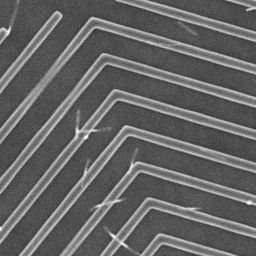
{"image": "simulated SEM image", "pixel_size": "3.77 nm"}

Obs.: groups of lines, slits or small figures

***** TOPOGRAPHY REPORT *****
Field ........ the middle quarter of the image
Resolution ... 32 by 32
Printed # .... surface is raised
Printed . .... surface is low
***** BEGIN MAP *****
.......###...########...........
......###.......########........
.....###............########....
.....##................########.
....###....................#####
...###........................##
..###...........................
..##.......######...............
.##........#########............
##........###...########........
##.......###.......########.....
#.......###............########.
........##................######
.......##....................###
......###.......................
.....###........................
...####.......#####.............
...###........#########.........
..####.......##....########.....
..###.......###.......########..
.###.......###...........#######
###.......###...............####
##.......###....................
##.......##.....................
#.......###.....................
.......###.......#####..........
......###.......##########......
.....###........##...########...
....###........###......########
....###.......###...........####
...###.......###...............#
..###.......###.................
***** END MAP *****